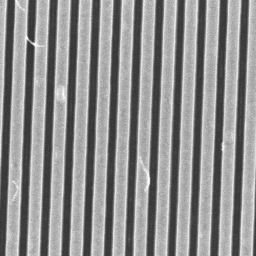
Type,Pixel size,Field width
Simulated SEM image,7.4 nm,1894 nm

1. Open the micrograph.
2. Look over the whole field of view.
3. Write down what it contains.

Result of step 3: parallel lines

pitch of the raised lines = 21.3 pixels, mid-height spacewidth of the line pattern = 0.0628 micrometres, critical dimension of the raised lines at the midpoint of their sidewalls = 0.0952 µm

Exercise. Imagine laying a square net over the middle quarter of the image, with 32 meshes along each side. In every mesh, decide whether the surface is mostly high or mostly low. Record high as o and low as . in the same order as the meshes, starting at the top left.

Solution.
o..ooo...ooo..ooo..ooo...ooo..oo
o..ooo..ooo...ooo..ooo...oo...oo
o..ooo..ooo...ooo..ooo..ooo...oo
o..ooo..ooo...ooo..ooo..ooo...oo
o..ooo..ooo...ooo..ooo..ooo...oo
o..ooo...ooo..ooo..ooo..ooo...oo
o..ooo...ooo..ooo..ooo..ooo...oo
o..ooo..ooo...ooo..ooo..ooo...oo
o..ooo..ooo...ooo..ooo..ooo...oo
o..ooo..ooo...ooo..ooo..ooo...oo
o..ooo..ooo..ooo...ooo..ooo...oo
o..ooo..ooo..ooo...ooo..ooo..ooo
o..ooo..ooo..ooo...ooo..ooo..ooo
o..ooo..ooo..ooo...ooo..ooo..ooo
o..ooo..ooo..ooo...ooo..ooo..ooo
...ooo..ooo..ooo...ooo..ooo..ooo
...ooo..ooo..ooo...ooo..ooo..ooo
...ooo..ooo..ooo...ooo..ooo..ooo
...ooo..ooo..ooo...ooo..ooo..ooo
..oooo..ooo..ooo..ooo...ooo..ooo
..oooo..ooo..ooo..ooo...ooo..ooo
..oooo..ooo..ooo..ooo...ooo..ooo
..oooo..ooo..ooo..ooo...ooo..ooo
..oooo..ooo..ooo..ooo...ooo..ooo
...oo...ooo..ooo..ooo...ooo..ooo
..ooo...ooo..ooo..ooo...ooo..ooo
..ooo...ooo..ooo..ooo...ooo..ooo
..ooo...oo...ooo..ooo...ooo..ooo
..ooo...oo...ooo..ooo..ooo...ooo
..ooo..ooo...ooo..ooo..ooo...ooo
..ooo..ooo...ooo..ooo..ooo...ooo
..ooo..ooo...ooo..ooo..ooo...ooo